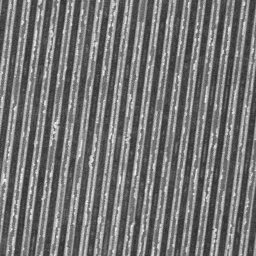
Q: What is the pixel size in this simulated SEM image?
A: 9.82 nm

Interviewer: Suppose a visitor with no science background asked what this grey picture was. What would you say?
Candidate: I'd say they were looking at parallel lines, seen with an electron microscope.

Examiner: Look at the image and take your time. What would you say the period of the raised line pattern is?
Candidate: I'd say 142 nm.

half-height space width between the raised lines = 74.3 nm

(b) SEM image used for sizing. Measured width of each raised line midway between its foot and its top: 67 nm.